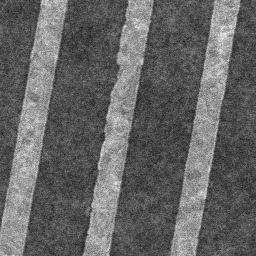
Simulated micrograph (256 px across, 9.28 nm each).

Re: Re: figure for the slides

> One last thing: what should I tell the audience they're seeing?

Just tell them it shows one or a few lines or trenches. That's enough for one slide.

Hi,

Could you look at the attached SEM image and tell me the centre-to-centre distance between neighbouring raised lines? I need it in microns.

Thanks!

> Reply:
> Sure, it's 0.786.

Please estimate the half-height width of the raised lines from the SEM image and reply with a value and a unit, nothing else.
224 nm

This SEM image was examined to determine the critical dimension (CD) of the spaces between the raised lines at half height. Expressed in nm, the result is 554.